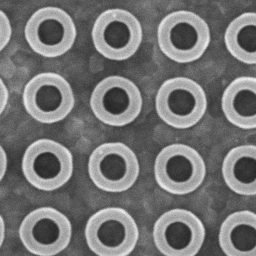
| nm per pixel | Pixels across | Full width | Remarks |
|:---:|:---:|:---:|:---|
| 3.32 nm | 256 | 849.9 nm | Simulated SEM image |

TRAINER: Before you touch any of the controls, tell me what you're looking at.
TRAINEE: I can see a regular array of ring-shaped raised bodies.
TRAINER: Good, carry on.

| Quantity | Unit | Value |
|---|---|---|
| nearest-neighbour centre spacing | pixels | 65.9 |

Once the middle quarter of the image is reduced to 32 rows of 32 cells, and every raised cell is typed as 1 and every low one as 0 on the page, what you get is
00000000000000000000000000000000
00000000000000000000000000000000
00000000000000000000000000000000
00000000000111100000000000000000
10000000011111111000000000111111
10000000111111111100000001111111
11000000111000011110000011110011
11000001110000001110000011000000
11000001110000001110000111000000
11000001110000000110000111000000
11000001110000001110000111000000
11000001110000011110000111000000
10000000111100111100000011110001
00000000111111111100000011111111
00000000001111110000000000111111
00000000000000000000000000011111
00000000000000000000000000000000
00000000000000000000000000000000
00000000000000000000000000000000
00000000000000000000000000000000
00000000011111100000000000011110
10000000111111110000000001111111
11000001111001111000000011111111
11000011110000011100000111000001
11000011100000011100000111000000
11000011100000001110000110000000
11000001100000001110000110000000
11000001110000011100000111000000
10000001110000011100000111000000
00000000111111111000000011110011
00000000011111111000000011111111
00000000001111100000000000111111